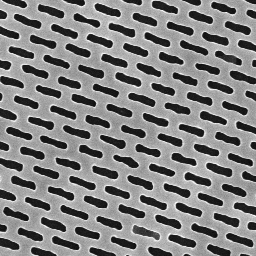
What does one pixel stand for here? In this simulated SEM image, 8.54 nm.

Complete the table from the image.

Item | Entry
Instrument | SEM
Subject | a regular array of holes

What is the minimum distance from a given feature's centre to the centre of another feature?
200 nm